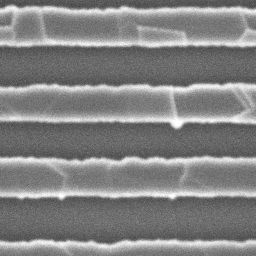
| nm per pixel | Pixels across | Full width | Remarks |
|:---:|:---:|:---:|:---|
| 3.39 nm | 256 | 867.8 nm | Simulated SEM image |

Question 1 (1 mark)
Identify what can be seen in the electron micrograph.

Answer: lines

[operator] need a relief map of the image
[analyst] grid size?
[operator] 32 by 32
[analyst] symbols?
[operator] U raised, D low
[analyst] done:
DDDDDDDDDDDDDDDDDDDDDDDDDDDDDDDD
UUUUUUUUUUUUUUUUUUUUUUUUUUUUUUUU
UUUUUUUUUUUUUUUUUUUUUUUUUUUUUUUU
UUUUUUUUUUUUUUUUUUUUUUUUUUUUUUUU
UUUUUUUUUUUUUUUUUUUUUUUUUUUUUUUU
UUUUUUUUUUUUUUUUUUUUUUUUUUUUUUUU
DDDDDDDDDDDDDDDDDDDDDDDDDDDDDDDD
DDDDDDDDDDDDDDDDDDDDDDDDDDDDDDDD
DDDDDDDDDDDDDDDDDDDDDDDDDDDDDDDD
DDDDDDDDDDDDDDDDDDDDDDDDDDDDDDDD
DDDDDDDDDDDDDDDDDDDDDDDDDDDDDDDD
UUUUUUUUUUUUUUUUUUUUUUUUUUUUUUUU
UUUUUUUUUUUUUUUUUUUUUUUUUUUUUUUU
UUUUUUUUUUUUUUUUUUUUUUUUUUUUUUUU
UUUUUUUUUUUUUUUUUUUUUUUUUUUUUUUU
DDDDDDDDDDDDDDDDDDDDDDDDDDDDDDDD
DDDDDDDDDDDDDDDDDDDDDDDDDDDDDDDD
DDDDDDDDDDDDDDDDDDDDDDDDDDDDDDDD
DDDDDDDDDDDDDDDDDDDDDDDDDDDDDDDD
DDDDDDDDDDDDDDDDDDDDDDDDDDDDDDDD
UUUUUUUUUUUUUUUUUUUUUUUUUUUUUUUU
UUUUUUUUUUUUUUUUUUUUUUUUUUUUUUUU
UUUUUUUUUUUUUUUUUUUUUUUUUUUUUUUU
UUUUUUUUUUUUUUUUUUUUUUUUUUUUUUUU
DDDUUDDDDDDDDDUDDDDDDDDDDDDDDDDD
DDDDDDDDDDDDDDDDDDDDDDDDDDDDDDDD
DDDDDDDDDDDDDDDDDDDDDDDDDDDDDDDD
DDDDDDDDDDDDDDDDDDDDDDDDDDDDDDDD
DDDDDDDDDDDDDDDDDDDDDDDDDDDDDDDD
DDDDDDDDDDDDDDDDDDDDDDDDDDDDDDDD
UUUUUUUUUUUUDDUUUUUUUUUUUUUUUUUU
UUUUUUUUUUUUUUUUUUUUUUUUUUUUUUUU